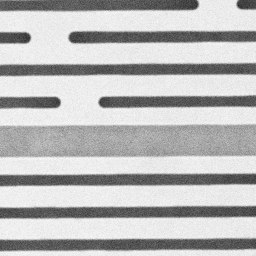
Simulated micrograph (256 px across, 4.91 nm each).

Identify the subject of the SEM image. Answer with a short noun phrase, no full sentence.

groups of lines, slits or small figures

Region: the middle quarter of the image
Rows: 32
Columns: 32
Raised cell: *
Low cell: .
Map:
................................
................................
................................
********************************
********************************
********************************
********************************
********************************
*********.......................
********........................
*********.......................
********************************
********************************
********************************
********************************
................................
................................
................................
................................
................................
................................
................................
................................
********************************
********************************
********************************
********************************
*****...........................
................................
................................
................**.....*********
********************************